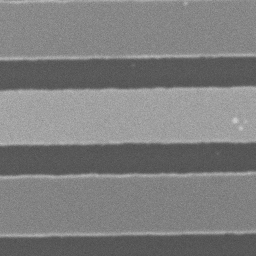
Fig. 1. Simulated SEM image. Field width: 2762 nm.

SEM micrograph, lines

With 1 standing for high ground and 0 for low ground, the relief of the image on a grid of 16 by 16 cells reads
1111111111111111
1111111111111111
1111111111111111
1111111111111100
0000000000000000
0000000000000011
1111111111111111
1111111111111111
1111111111111111
0000000000000000
0000000000000000
1111111111111111
1111111111111111
1111111111111111
1111111111111111
0000000000000000